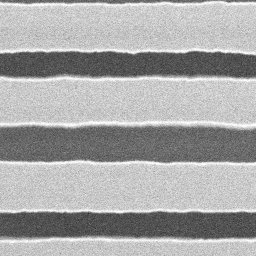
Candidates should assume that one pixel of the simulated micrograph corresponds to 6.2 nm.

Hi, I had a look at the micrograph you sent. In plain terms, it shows lines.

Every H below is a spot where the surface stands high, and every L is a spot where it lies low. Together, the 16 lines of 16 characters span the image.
HHHHHHHHHHHHHHHH
HHHHHHHHHHHHHHHH
HHHHHHHHHHHHHHHH
LLLLLLLLLLLLLLLL
LLLLLLLLLLLLLLLL
HHHHHHHHHHHHHHHH
HHHHHHHHHHHHHHHH
HHHHHHHHHHHHHHHH
LLLLLLLLLLLLLLLL
LLLLLLLLLLLLLLLL
HHHHHHHHHHHHHHHH
HHHHHHHHHHHHHHHH
HHHHHHHHHHHHHHHH
LLLLLLLLLLLLLLLL
LLLLLLLLLLLLLLLL
HHHHHHHHHHHHHHHH